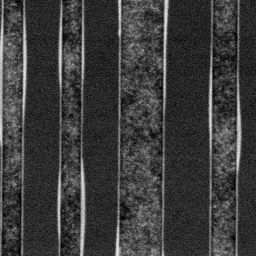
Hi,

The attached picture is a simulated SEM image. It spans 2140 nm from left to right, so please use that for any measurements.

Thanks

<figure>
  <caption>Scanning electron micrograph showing groups of lines, slits or small figures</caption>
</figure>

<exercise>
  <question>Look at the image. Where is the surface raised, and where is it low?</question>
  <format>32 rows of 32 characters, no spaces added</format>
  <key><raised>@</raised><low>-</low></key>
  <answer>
---@@@@@--@@@@@------@@@@@@---@@
---@@@@@--@@@@@------@@@@@@---@@
---@@@@@--@@@@@------@@@@@@---@@
---@@@@@--@@@@@------@@@@@----@@
---@@@@@--@@@@@------@@@@@----@@
---@@@@@--@@@@@------@@@@@----@@
---@@@@@--@@@@@------@@@@@----@@
---@@@@@--@@@@@------@@@@@----@@
---@@@@@--@@@@@------@@@@@----@@
---@@@@@--@@@@@------@@@@@----@@
---@@@@@--@@@@@------@@@@@----@@
---@@@@@--@@@@@------@@@@@----@@
---@@@@@--@@@@@------@@@@@----@@
---@@@@@--@@@@@------@@@@@----@@
---@@@@@--@@@@@------@@@@@----@@
---@@@@@--@@@@@------@@@@@----@@
---@@@@@--@@@@@------@@@@@----@@
---@@@@@--@@@@@-----@@@@@@----@@
---@@@@@--@@@@@-----@@@@@@----@@
---@@@@@--@@@@@-----@@@@@@----@@
---@@@@@--@@@@@-----@@@@@@----@@
---@@@@@--@@@@@-----@@@@@@----@@
---@@@@---@@@@@-----@@@@@@----@@
---@@@@---@@@@@-----@@@@@@----@@
---@@@@---@@@@@-----@@@@@@----@@
---@@@@---@@@@@-----@@@@@@----@@
---@@@@---@@@@@-----@@@@@@----@@
---@@@@---@@@@@-----@@@@@@----@@
---@@@@---@@@@@-----@@@@@@----@@
---@@@@---@@@@@-----@@@@@@----@@
---@@@@---@@@@@-----@@@@@@----@@
---@@@@---@@@@@-----@@@@@@----@@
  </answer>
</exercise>